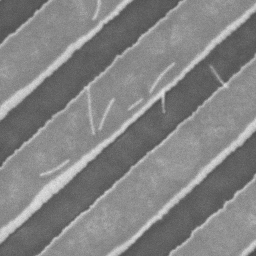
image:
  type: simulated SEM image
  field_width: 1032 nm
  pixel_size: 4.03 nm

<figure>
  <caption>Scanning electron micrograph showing lines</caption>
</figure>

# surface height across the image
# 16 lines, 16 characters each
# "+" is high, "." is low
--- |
...+++++...+++++
.++++++...+++++.
+++++....+++++..
++++...++++++...
+++...++++++...+
++...++++++...++
+...+++++....+++
...+++++....++++
..+++++....++++.
.+++++...+++++..
+++++...+++++...
++++...+++++...+
+++...+++++...++
++...+++++...+++
+...+++++...++++
...+++++...+++++